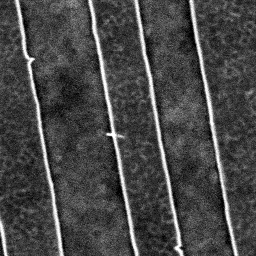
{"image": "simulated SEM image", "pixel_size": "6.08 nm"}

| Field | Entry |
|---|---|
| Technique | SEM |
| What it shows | one or a few lines or trenches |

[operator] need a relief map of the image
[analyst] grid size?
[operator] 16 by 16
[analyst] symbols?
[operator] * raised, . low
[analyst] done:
*.....***...****
*.....***...****
*.....***...****
**....***....***
**....***....***
**.....**....***
**.....***...***
**.....***...***
***....***...***
***....***....**
***....***....**
***.....***...**
***.....***...**
***.....***...**
****....***...**
****....***....*